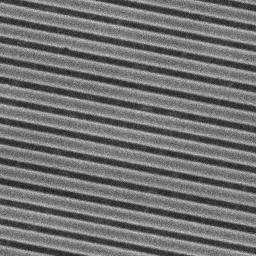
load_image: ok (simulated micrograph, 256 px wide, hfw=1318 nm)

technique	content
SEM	parallel lines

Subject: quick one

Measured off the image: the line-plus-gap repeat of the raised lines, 102 nm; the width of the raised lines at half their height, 0.0619 micrometres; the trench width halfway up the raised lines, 39.9 nanometres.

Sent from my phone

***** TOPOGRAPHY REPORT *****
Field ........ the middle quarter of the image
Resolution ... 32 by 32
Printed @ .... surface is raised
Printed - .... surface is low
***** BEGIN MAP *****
@@@@@@@@@@@@@----------@@@@@@@@@
---@@@@@@@@@@@@@@@----------@@@@
--------@@@@@@@@@@@@@@@---------
@@-----------@@@@@@@@@@@@@@@----
@@@@@@@-----------@@@@@@@@@@@@@@
@@@@@@@@@@@@@----------@@@@@@@@@
--@@@@@@@@@@@@@@@@----------@@@@
--------@@@@@@@@@@@@@@@---------
@@-----------@@@@@@@@@@@@@@@----
@@@@@@@-----------@@@@@@@@@@@@@@
@@@@@@@@@@@@-----------@@@@@@@@@
--@@@@@@@@@@@@@@@@----------@@@@
--------@@@@@@@@@@@@@@@---------
@@-----------@@@@@@@@@@@@@@@----
@@@@@@@-----------@@@@@@@@@@@@@@
@@@@@@@@@@@-----------@@@@@@@@@@
-@@@@@@@@@@@@@@@@-----------@@@@
------@@@@@@@@@@@@@@@@@---------
@----------@@@@@@@@@@@@@@@@@----
@@@@@@-----------@@@@@@@@@@@@@@@
@@@@@@@@@@@-----------@@@@@@@@@@
-@@@@@@@@@@@@@@@-----------@@@@@
------@@@@@@@@@@@@@@@-----------
@----------@@@@@@@@@@@@@@@@-----
@@@@@@-----------@@@@@@@@@@@@@@@
@@@@@@@@@@@-----------@@@@@@@@@@
-@@@@@@@@@@@@@@@-----------@@@@@
------@@@@@@@@@@@@@@@-----------
@----------@@@@@@@@@@@@@@@------
@@@@@@----------@@@@@@@@@@@@@@@@
@@@@@@@@@@@-----------@@@@@@@@@@
-@@@@@@@@@@@@@@@-----------@@@@@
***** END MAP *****